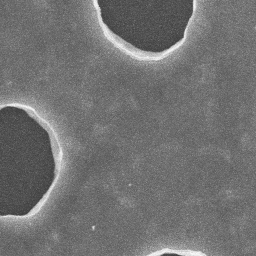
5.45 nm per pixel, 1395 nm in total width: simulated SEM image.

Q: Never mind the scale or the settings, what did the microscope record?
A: holes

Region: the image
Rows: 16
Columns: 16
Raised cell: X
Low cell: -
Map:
XXXXXX------XXXX
XXXXXXX-----XXXX
XXXXXXX----XXXXX
XXXXXXXXX-XXXXXX
XXXXXXXXXXXXXXXX
XXXXXXXXXXXXXXXX
XXXXXXXXXXXXXXXX
---XXXXXXXXXXXXX
---XXXXXXXXXXXXX
----XXXXXXXXXXXX
----XXXXXXXXXXXX
---XXXXXXXXXXXXX
---XXXXXXXXXXXXX
-XXXXXXXXXXXXXXX
XXXXXXXXXXXXXXXX
XXXXXXXXXXXXXXXX